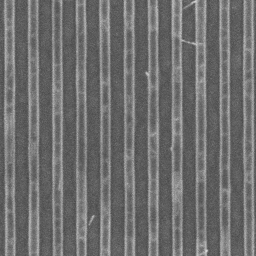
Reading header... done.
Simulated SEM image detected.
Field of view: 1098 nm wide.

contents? parallel lines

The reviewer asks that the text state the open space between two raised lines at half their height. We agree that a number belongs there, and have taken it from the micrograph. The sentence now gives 65.5 nanometers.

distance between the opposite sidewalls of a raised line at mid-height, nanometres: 36.5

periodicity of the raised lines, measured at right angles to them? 103 nm